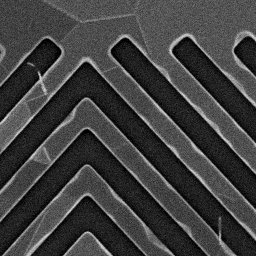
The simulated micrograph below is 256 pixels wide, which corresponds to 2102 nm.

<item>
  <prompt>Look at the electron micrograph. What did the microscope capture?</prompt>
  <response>groups of lines, slits or small figures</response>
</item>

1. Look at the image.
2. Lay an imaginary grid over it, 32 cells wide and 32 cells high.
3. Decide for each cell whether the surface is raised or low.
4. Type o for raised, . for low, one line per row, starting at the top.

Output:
oooooooooooooooooooooooooooooooo
oooooooooooooooooooooooooooooooo
oooooooooooooooooooooooooooooooo
oooooooooooooooooooooooooooooooo
oooooooooooooooooooooooooooooo.o
ooooo..ooooooo...ooooo...ooooo..
oooo....oooooo....ooo....oooo...
ooo....ooooooo.....ooo....oooo..
oo....oooo..ooo.....ooo....oooo.
o....oooo....ooo.....ooo....oooo
....oooo......ooo....oooo....ooo
....ooo........ooo....oooo....oo
...ooo....o.....ooo....oooo....o
..ooo....ooo....oooo....oooo....
.ooo.....oooo....oooo....oooo...
ooo.....oooooo....oooo....oooo..
oo.....ooo..ooo....oooo....oooo.
oo....ooo...oooo....oooo....oooo
o....ooo.....oooo....oooo....ooo
....ooo.......oooo....oooo....oo
...oooo........oooo....oooo....o
..oooo....oo....oooo....oooo....
.oooo....oooo....oooo....ooo....
oooo....oooooo....oooo....ooo...
ooo....oooooooo....oooo....ooo..
oo....oooo..oooo....oooo....ooo.
o....oooo....oooo....ooo.....ooo
....oooo......oooo....ooo.....oo
...oooo........ooo.....ooo.....o
...ooo....oo....ooo.....ooo.....
..ooo....oooo....ooo.....ooo....
.ooo....ooooo.....ooo.....ooo...